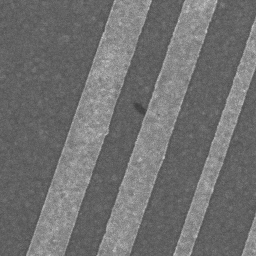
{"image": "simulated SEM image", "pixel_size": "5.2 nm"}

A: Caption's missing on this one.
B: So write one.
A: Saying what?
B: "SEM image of one or a few lines or trenches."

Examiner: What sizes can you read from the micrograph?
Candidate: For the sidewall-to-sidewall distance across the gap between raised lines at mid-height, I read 216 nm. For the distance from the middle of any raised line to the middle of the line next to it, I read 336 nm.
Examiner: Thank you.